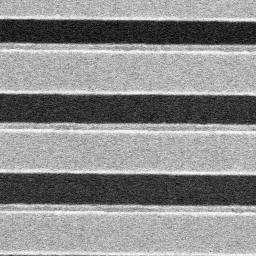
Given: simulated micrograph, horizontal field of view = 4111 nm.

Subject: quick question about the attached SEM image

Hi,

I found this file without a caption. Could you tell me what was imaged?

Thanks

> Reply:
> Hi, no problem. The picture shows lines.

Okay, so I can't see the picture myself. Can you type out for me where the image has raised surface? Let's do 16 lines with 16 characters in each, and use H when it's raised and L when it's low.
HHHHHHHHHHHHHHHH
LLLLLLLLLLLLLLLL
LLLLLLLLLLLLLLLL
HHHHHHHHHHHHHHHH
HHHHHHHHHHHHHHHH
HHHHHHHHHHHHHHHH
LLLLLLLLLLLLLLLL
LLLLLLLLLLLLLLLL
HHHHHHHHHHHHHHHH
HHHHHHHHHHHHHHHH
HHHHHHHHHHHHHHHH
LLLLLLLLLLLLLLLL
LLLLLLLLLLLLLLLL
HHHHHHHHHHHHHHHH
HHHHHHHHHHHHHHHH
HHHHHHHHHHHHHHHH